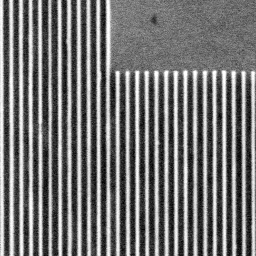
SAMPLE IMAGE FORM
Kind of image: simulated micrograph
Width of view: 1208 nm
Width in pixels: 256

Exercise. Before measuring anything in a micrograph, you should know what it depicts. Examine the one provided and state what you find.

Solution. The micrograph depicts parallel lines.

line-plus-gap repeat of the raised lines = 45.7 nm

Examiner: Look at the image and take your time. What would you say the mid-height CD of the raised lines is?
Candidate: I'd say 0.0124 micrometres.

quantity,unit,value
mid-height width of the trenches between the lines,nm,32.5